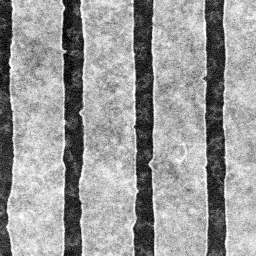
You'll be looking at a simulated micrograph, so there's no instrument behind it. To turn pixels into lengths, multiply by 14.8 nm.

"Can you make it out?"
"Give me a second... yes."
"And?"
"one or a few lines or trenches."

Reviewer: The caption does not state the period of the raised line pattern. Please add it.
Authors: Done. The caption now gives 1.05 um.